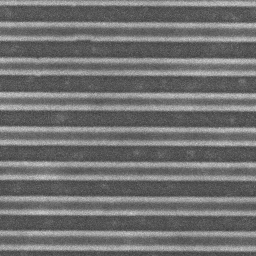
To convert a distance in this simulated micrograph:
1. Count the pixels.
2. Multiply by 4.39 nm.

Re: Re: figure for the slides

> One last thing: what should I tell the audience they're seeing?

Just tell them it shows parallel lines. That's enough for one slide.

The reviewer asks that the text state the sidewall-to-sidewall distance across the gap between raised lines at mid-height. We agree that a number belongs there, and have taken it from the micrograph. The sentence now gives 92.1 nanometers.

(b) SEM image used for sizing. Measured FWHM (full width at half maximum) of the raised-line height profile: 61.4 nm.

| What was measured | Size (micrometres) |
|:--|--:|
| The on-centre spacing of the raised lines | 0.153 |